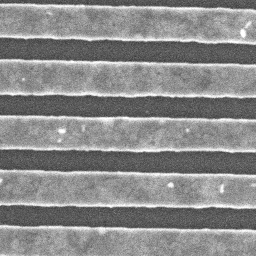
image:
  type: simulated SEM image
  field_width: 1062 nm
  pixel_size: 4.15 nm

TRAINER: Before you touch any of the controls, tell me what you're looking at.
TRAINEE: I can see lines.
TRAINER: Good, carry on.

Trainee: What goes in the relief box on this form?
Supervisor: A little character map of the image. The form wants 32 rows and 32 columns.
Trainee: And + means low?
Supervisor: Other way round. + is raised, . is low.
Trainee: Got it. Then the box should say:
................................
++++++++++++++++++++++++++++++++
++++++++++++++++++++++++++++++++
++++++++++++++++++++++++++++++++
++++++++++++++++++++++++++++++++
................................
................................
................................
++++++++++++++++++++++++++++++++
++++++++++++++++++++++++++++++++
++++++++++++++++++++++++++++++++
++++++++++++++++++++++++++++++++
................................
................................
................................
++++++++++++++++++++++++++++++++
++++++++++++++++++++++++++++++++
++++++++++++++++++++++++++++++++
+.++++++++++++++++++++++++++++++
................................
................................
++++++++........................
++++++++++++++++++++++++++++++++
++++++++++++++++++++++++++++++++
++++++++++++++++++++++++++++++++
++++++++++++++++++++++++++++++++
................................
................................
+++++++++++.....................
++++++++++++++++++++++++++++++++
++++++++++++++++++++++++++++++++
++++++++++++++++++++++++++++++++